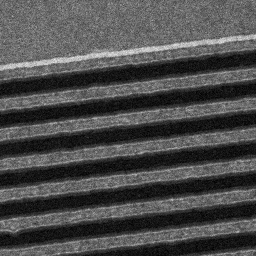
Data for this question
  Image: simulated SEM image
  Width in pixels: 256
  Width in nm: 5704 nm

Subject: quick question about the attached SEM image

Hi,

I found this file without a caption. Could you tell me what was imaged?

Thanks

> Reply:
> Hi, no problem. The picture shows parallel lines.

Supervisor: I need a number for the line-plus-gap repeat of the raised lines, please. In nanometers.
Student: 669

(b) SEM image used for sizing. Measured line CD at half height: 299 nm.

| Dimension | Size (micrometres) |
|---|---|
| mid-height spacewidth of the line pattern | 0.384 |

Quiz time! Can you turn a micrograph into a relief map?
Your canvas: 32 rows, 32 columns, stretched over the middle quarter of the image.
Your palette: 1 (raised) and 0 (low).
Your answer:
11111111111111000000000000000000
11111100000000000000000000000000
00000000000000000000000000000000
00000000000000000000000000111111
00000000000000000011111111111111
00000000001111111111111111111111
00111111111111111111111111100000
11111111111111111111000000000000
11111111111100000000000000000000
11110000000000000000000000000000
00000000000000000000000000000011
00000000000000000000001111111111
00000000000001111111111111111111
00000011111111111111111111111111
11111111111111111111111000000000
11111111111111010000000000000000
11111100000000000000000000000000
00000000000000000000000000000000
00000000000000000000000000111111
00000000000000000011111111111111
00000000001111111111111111111111
00011111111111111111111111110000
11111111111111111111000000000000
11111111111000000000000000000000
11110000000000000000000000000000
00000000000000000000000000000011
00000000000000000000001011111111
00000000000000101111111111111111
00000011111111111111111111111111
11111111111111111111111100000000
11111111111111110000000000000000
11111110000000000000000000000000